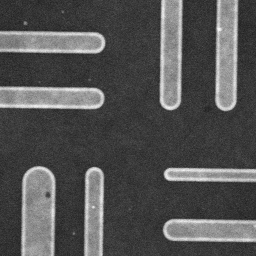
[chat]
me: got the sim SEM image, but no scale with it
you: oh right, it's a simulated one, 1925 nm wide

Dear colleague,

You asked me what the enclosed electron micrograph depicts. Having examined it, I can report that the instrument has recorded groups of lines, slits or small figures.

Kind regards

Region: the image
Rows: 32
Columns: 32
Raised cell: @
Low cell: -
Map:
--------------------@@@----@@@--
--------------------@@@----@@@--
--------------------@@@----@@---
--------------------@@@----@@---
@@@@@@@@@@@@@-------@@@----@@---
@@@@@@@@@@@@@-------@@@----@@---
---------@@@--------@@@----@@---
--------------------@@@----@@---
--------------------@@-----@@---
--------------------@@-----@@---
--------------------@@-----@@---
@@@@@@@@@@@@@-------@@-----@@---
@@@@@@@@@@@@@-------@@-----@@---
---------------------@------@---
--------------------------------
--------------------------------
--------------------------------
--------------------------------
--------------------------------
--------------------------------
--------------------------------
---@@@-----@@--------@@@@@@@@@@@
---@@@@----@@-----------@@@@@@@@
---@@@@----@@-------------------
---@@@@----@@-------------------
---@@@@----@@-------------------
---@@@@----@@-------------------
---@@@@----@@-------------------
---@@@@----@@--------@@@@@@@@@@@
---@@@@----@@--------@@@@@@@@@@@
---@@@@----@@-------------------
---@@@@----@@-------------------